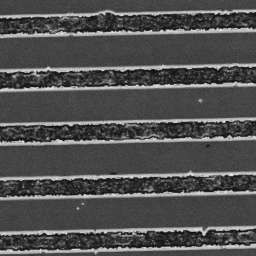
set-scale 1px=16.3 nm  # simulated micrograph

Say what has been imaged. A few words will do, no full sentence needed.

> parallel lines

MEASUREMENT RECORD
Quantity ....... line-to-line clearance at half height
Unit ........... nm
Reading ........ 556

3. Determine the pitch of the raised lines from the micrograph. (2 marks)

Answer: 882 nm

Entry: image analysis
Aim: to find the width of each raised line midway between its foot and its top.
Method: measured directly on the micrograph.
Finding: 318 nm